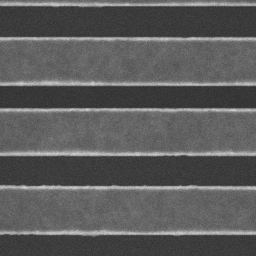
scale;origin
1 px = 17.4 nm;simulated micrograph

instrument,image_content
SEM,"lines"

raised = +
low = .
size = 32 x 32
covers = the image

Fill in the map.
++++++++++++++++++++++++++++++++
................................
................................
................................
................................
++++++++++++++++++++++++++++++++
++++++++++++++++++++++++++++++++
++++++++++++++++++++++++++++++++
++++++++++++++++++++++++++++++++
++++++++++++++++++++++++++++++++
++++++++++++++++++++++++++++++++
................................
................................
................................
++++++++++++++++++++++++++++++++
++++++++++++++++++++++++++++++++
++++++++++++++++++++++++++++++++
++++++++++++++++++++++++++++++++
++++++++++++++++++++++++++++++++
................................
................................
................................
................................
++++++++++++++++++++++++++++++++
++++++++++++++++++++++++++++++++
++++++++++++++++++++++++++++++++
++++++++++++++++++++++++++++++++
++++++++++++++++++++++++++++++++
++++++++++++++++++++++++++++++++
................................
................................
................................